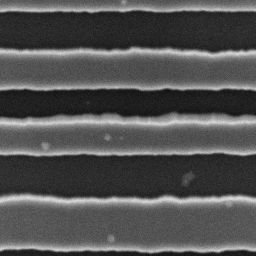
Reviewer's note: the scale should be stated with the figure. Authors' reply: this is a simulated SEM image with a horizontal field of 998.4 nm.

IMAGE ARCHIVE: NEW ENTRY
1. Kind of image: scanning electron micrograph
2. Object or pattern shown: lines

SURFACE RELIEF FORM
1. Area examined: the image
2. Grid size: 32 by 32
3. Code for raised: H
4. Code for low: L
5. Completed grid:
HHHHHHHHHHHHHHHHHHHHHHHHHHHHHHHH
LLLLLLLLLLLLLLLLLLLLLLLLLLLLLLLL
LLLLLLLLLLLLLLLLLLLLLLLLLLLLLLLL
LLLLLLLLLLLLLLLLLLLLLLLLLLLLLLLL
LLLLLLLLLLLLLLLLLLLLLLLLLLLLLLLL
LLLLLLLLLLLLLLLLLLLLLLLLLLLLLLLL
HLLLLLLLLLHLLLLLHHHLHHLLLLLLLLLL
HHHHHHHHHHHHHHHHHHHHHHHHHHHHHHHH
HHHHHHHHHHHHHHHHHHHHHHHHHHHHHHHH
HHHHHHHHHHHHHHHHHHHHHHHHHHHHHHHH
HHHHHHHHHHHHHHHHHHHHHHHHHHHHHHHH
LLLLLLLLLLLLLLLLLLLLLLLLLLLLLLLL
LLLLLLLLLLLLLLLLLLLLLLLLLLLLLLLL
LLLLLLLLLLLLLLLLLLLLLLLLLLLLLLLL
LLLLLLLLLLLLLLLLLLLLLLLLLLLLLLLL
HHHHHHHHHHHHHHHHHHHHHHHHHHHHHHHH
HHHHHHHHHHHHHHHHHHHHHHHHHHHHHHHH
HHHHHHHHHHHHHHHHHHHHHHHHHHHHHHHH
HHHHHHHHHHHHHHHHHHHHHHHHHHHHHHHH
LLLLLLLLLLLLLLLLLLLLLLLLLLLLLLLL
LLLLLLLLLLLLLLLLLLLLLLLLLLLLLLLL
LLLLLLLLLLLLLLLLLLLLLLLLLLLLLLLL
LLLLLLLLLLLLLLLLLLLLLLLLLLLLLLLL
LLLLLLLLLLLLLLLLLLLLLLLLLLLLLLLL
LLLLLLLLLLLLLLLLLLLLLLLLLLLLLLLL
HHHHHHHHHHHHHHHHHHHHHHHHHHHHHHHH
HHHHHHHHHHHHHHHHHHHHHHHHHHHHHHHH
HHHHHHHHHHHHHHHHHHHHHHHHHHHHHHHH
HHHHHHHHHHHHHHHHHHHHHHHHHHHHHHHH
HHHHHHHHHHHHHHHHHHHHHHHHHHHHHHHH
HHHHHHHHHHHHHHHHHHHHHHHHHHHHHHHH
LLLLLLLLLLLLLLLLLLHLLLLLLLLLLLLL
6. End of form